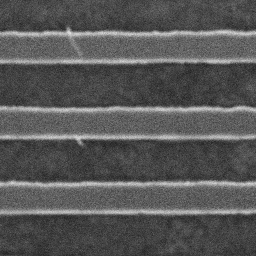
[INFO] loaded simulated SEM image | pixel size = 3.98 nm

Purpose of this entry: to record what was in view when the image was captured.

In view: lines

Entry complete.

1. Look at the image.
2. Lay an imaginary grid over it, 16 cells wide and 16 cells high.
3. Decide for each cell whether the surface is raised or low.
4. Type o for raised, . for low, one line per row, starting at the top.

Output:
................
................
oooooooooooooooo
oooooooooooooooo
................
................
................
oooooooooooooooo
oooooooooooooooo
................
................
oooooooooooooooo
oooooooooooooooo
................
................
................